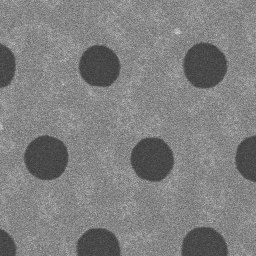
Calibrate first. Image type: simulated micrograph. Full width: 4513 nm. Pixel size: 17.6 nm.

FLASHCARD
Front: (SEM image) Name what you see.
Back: holes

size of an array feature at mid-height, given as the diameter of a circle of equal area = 783 nanometers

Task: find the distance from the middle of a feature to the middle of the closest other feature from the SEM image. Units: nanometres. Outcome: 1860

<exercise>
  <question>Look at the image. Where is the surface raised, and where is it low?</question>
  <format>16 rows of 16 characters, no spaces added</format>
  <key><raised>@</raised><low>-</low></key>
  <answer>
@@@@@@@@@@@@@@@@
@@@@@@@@@@@@@@@@
@@@@@@@@@@@@@@@@
-@@@@--@@@@@--@@
-@@@@--@@@@@--@@
@@@@@@@@@@@@-@@@
@@@@@@@@@@@@@@@@
@@@@@@@@@@@@@@@@
@@@@@@@@@@@@@@@@
@@--@@@@---@@@@-
@@--@@@@---@@@@-
@@@@@@@@@@@@@@@@
@@@@@@@@@@@@@@@@
@@@@@@@@@@@@@@@@
@@@@@--@@@@@--@@
-@@@@--@@@@---@@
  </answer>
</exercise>